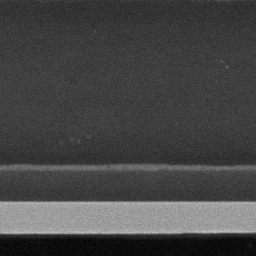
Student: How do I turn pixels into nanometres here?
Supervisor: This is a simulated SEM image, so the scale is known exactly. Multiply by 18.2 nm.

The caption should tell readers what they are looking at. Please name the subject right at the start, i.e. lines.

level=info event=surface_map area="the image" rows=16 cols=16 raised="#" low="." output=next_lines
................
................
................
................
................
................
................
................
................
................
................
################
################
################
################
................